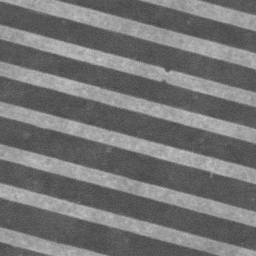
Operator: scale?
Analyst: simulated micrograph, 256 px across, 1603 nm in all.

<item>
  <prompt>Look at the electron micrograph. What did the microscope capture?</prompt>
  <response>parallel lines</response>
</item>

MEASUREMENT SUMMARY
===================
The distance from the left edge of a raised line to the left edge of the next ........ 240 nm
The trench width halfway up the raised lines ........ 0.16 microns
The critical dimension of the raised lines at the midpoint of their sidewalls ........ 0.0795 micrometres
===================